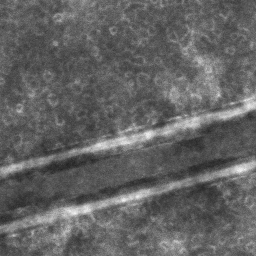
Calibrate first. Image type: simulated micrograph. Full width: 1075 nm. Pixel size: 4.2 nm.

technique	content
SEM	one or a few lines or trenches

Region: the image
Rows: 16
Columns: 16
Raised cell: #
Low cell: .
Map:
################
################
################
################
################
################
################
#############...
#########.......
#####...........
#..............#
...........#####
.......#########
...#############
################
################